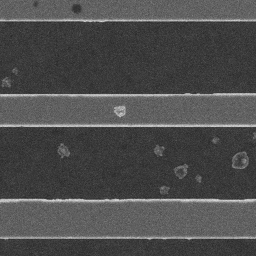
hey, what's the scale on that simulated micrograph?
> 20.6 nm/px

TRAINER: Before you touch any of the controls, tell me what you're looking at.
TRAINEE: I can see lines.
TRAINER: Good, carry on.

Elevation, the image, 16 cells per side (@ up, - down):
@@@@@@@@@@@@@@@@
----------------
----------------
----------------
----------------
----------------
@@@@@@@@@@@@@@@@
@@@@@@@@@@@@@@@@
----------------
----------------
----------------
----------------
-@@------@@@----
@@@@@@@@@@@@@@@@
@@@@@@@@@@@@@@@@
----------------